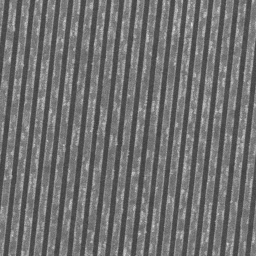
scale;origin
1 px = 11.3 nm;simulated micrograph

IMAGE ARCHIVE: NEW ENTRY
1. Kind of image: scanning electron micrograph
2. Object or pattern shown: parallel lines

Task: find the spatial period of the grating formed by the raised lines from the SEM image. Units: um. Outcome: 0.142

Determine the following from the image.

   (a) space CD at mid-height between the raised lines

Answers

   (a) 64.4 nm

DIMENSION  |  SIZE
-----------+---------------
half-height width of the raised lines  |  79.8 nm